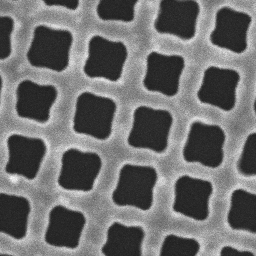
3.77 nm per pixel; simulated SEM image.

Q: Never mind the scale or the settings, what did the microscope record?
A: a regular array of holes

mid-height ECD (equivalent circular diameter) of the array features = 0.16 microns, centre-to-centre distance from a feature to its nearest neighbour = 212 nm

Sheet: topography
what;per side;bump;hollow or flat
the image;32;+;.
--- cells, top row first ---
++++++....++.....+++.....+++++++
++++++++++++.....+++.....++...++
..+++++++++++...+++......++....+
..++..+++++++++++++.....+++....+
.+++.....+++.+++++++++..++.....+
.+++.....++....++++++++++++....+
.++......++.....+++++++++++++.++
++++.....++.....++.....+++++++++
+++++...++.....+++.....+++.+++++
+++++++++++....+++.....++.....++
++...+++++++++++++....+++.....++
++.....+++++++++++++..+++....+++
++.....+++....+++++++++++....+++
++....+++......++..++++++++..+++
++....+++.....+++.....++++++++++
+++++++++.....+++.....++..++++++
++++++++++....++.....+++....++++
+....+++++++++++.....++.....+++.
+.....++++++++++++...++.....++..
+.....++....+++++++++++.....++..
+....+++.....++++++++++++...++..
+....+++....+++.....++++++++++..
+++++++.....+++.....++....++++++
++++++++...+++.....+++.....+++++
..++++++++++++.....+++....+++...
....++++++++++.....+++....+++...
....++....++++++++++++....+++...
....++.....+++++++++++++++++....
...+++....++++....+++++++++++...
+..+++....+++.....+++.++++++++++
++++++....+++.....++.....+++++++
+++++++++++++.....++.....+++...+